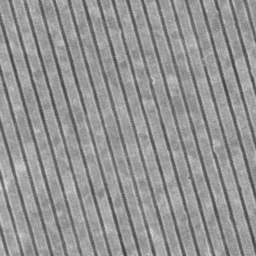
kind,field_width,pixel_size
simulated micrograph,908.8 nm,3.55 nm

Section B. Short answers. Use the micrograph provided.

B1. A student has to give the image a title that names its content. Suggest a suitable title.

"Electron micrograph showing parallel lines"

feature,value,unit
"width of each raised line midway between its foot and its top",9.77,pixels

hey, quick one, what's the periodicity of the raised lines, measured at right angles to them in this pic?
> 50.2 nm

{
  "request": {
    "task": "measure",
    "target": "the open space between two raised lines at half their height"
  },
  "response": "15.8 nanometres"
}